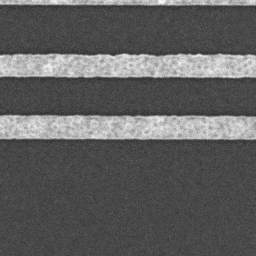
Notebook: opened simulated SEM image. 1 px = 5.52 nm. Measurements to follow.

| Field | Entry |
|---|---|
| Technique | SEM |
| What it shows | one or a few lines or trenches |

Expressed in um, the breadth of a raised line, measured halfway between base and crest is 0.118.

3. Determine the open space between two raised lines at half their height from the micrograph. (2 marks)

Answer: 250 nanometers